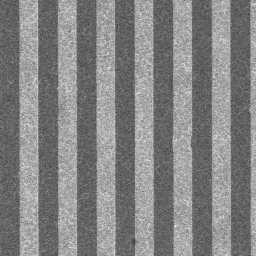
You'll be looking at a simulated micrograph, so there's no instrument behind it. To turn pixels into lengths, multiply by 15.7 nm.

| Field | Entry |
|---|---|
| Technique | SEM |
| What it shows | parallel lines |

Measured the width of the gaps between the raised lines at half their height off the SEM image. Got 318 nanometres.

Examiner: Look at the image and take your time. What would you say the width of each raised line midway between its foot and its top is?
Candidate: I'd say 0.243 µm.